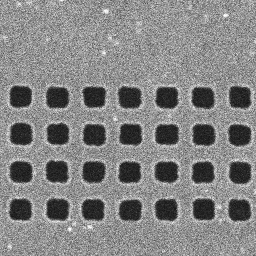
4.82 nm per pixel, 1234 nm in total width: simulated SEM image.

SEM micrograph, a regular array of holes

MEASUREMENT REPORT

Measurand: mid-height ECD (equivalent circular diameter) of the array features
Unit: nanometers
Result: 112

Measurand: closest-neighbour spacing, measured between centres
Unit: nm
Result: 174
